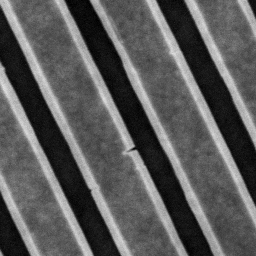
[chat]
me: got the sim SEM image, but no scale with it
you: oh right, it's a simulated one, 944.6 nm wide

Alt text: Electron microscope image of one or a few lines or trenches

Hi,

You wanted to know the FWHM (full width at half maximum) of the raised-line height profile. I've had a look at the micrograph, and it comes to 0.185 microns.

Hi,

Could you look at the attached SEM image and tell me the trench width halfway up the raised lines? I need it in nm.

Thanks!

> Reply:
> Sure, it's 123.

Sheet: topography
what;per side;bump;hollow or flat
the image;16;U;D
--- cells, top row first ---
UUUUDDUUUUDDUUUD
DUUUDDDUUUDDDUUU
DUUUUDDUUUUDDUUU
DDUUUDDDUUUDDDUU
DDUUUUDDUUUUDDUU
DDDUUUDDDUUUDDDU
UDDUUUUDDUUUUDDU
UDDDUUUDDDUUUDDU
UUDDUUUUDDUUUUDD
UUDDDUUUDDDUUUDD
UUUDDUUUUDDUUUUD
UUUDDDUUUDDDUUUD
DUUUDDUUUUDDUUUD
DUUUDDDUUUDDDUUU
DDUUUDDUUUUDDUUU
DDUUUDDDUUUDDUUU